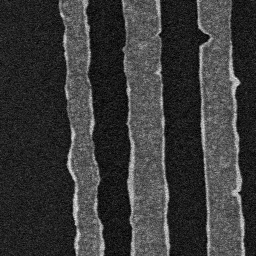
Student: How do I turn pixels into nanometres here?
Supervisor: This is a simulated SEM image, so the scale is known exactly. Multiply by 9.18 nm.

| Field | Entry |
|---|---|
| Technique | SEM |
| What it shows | one or a few lines or trenches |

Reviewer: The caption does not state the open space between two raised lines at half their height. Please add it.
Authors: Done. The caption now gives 0.357 microns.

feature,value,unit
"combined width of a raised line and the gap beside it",634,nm